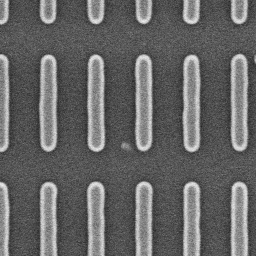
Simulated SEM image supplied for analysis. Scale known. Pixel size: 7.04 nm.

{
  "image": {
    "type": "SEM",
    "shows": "groups of lines, slits or small figures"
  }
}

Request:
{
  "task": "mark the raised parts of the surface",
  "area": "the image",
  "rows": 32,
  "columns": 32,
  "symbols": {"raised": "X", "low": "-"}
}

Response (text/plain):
X----XX----XX----XX----XX----XX-
X----XX----XX----XX----XX----XX-
X----------X-----------X-----X--
--------------------------------
--------------------------------
--------------------------------
--------------------------------
X----XX----XX----XX----XX----XX-
X----XX----XX----XX----XX----XX-
X----XX----XX----XX----XX----XX-
X----XX----XX----XX----XX----XX-
X----XX----XX----XX----XX----XX-
X----XX----XX----XX----XX----XX-
X----XX----XX----XX----XX----XX-
X----XX----XX----XX----XX----XX-
X----XX----XX----XX----XX----XX-
X----XX----XX----XX----XX----XX-
X----XX----XX----XX----XX----XX-
X-----------X----------X--------
--------------------------------
--------------------------------
--------------------------------
--------------------------------
X----XX----XX----XX----XX----XX-
X----XX----XX----XX----XX----XX-
X----XX----XX----XX----XX----XX-
X----XX----XX----XX----XX----XX-
X----XX----XX----XX----XX----XX-
X----XX----XX----XX----XX----XX-
X----XX----XX----XX----XX----XX-
X----XX----XX----XX----XX----XX-
X----XX----XX----XX----XX----XX-